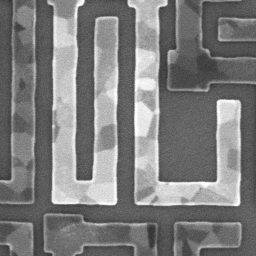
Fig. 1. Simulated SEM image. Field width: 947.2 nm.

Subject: wiring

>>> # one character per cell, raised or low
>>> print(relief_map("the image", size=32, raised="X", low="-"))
--XX--XXXX------XXXXX-XXX-------
--XX---XXX-------XXX--XXX-------
--XX---XXX--XXX--XXX--XXX--XXXXX
--XX---XXX--XXX--XXX--XXX--XXXXX
--XX---XXX--XXX--XXX--XXX--XXXXX
--XX---XXX--XXX--XXX--XXX-------
--XX---XXX--XXX--XXX-XXXXX------
--XX---XXX--XXX--XXX-XXXXXXXXXXX
--XX---XXX--XXX--XXX-XXXXXXXXXXX
--XX---XX---XXX--XXX-XXXXXXXXXXX
--XX---XX---XXX--XXX-XXXXX------
--XX---XX---XXX--XXX------------
--XX---XX---XXX--XXX------------
--XX---XX---XXX--XXX-------XXX--
--XX---XX---XX---XXX-------XXX--
--XX---XX---XXX--XXX-------XXX--
--XX---XX---XXX--XXX-------XXX--
--XX---XX---XXX--XXX-------XXX--
--XX---XX---XXX--XXX-------XXX--
--XX---XX---XXX--XXX-------XXX--
--XX---XX---XXX--XXX-------XXX--
--XX---XX---XX---XXX-------XXX--
-XXX---XXX-XXX---XXX-------XXX--
XXXX---XXXXXXX---XXXXXXXXXXXXX--
XXXX---XXXXXXXX--XXXXXXXXXXXXX--
-------------------XXX-X---XXX--
--------------------------------
------XXXXX---------------------
XXXX--XXXXXXXXXXXXXX--XXXXXXXX--
XXXX--XXXXXXXXXXXXXX--XXXXXXXX--
XXXX--XXXXXXXXXXXXX---XXXXXXXX--
-XXX--XXXX-------XXX--XXX-------